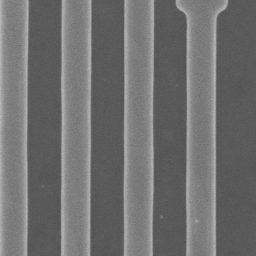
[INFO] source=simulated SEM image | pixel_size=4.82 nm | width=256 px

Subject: wiring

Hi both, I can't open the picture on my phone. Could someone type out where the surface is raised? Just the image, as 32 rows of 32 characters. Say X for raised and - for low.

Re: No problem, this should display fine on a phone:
XXX-----XXX-----XXX---XXXXXX----
XXX-----XXX-----XXX----XXXX-----
XXX-----XXX-----XXX----XXXX-----
XXX-----XXX-----XXX----XXXX-----
XXX-----XXX-----XXX----XXXX-----
XXX-----XXX-----XXX----XXXX-----
XXX-----XXX-----XXX----XXXX-----
XXX-----XXX-----XXX----XXXX-----
XXX-----XXX-----XXX----XXXX-----
XXX-----XXX-----XXX----XXXX-----
XXX-----XXX-----XXX----XXXX-----
XXX-----XXX-----XXX----XXXX-----
XXX-----XXX-----XXX----XXXX-----
XXX-----XXX-----XXX----XXXX-----
XXX-----XXX-----XXX----XXXX-----
XXX-----XXX-----XXX----XXXX-----
XXX-----XXX-----XXX----XXXX-----
XXX-----XXX-----XXX----XXXX-----
XXX-----XXX-----XXX----XXXX-----
XXX-----XXX-----XXX----XXXX-----
XXX-----XXX-----XXX----XXXX-----
XXX-----XXX-----XXX----XXXX-----
XXX-----XXX-----XXX----XXXX-----
XXX-----XXX-----XXX----XXXX-----
XXX-----XXX-----XXX----XXXX-----
XXX-----XXX-----XXX----XXXX-----
XXX-----XXX-----XXX----XXXX-----
XXX-----XXX-----XXX----XXXX-----
XXX-----XXX-----XXX----XXXX-----
XXX-----XXX-----XXX----XXXX-----
XXX-----XXX-----XXX----XXXX-----
XXX-----XXX-----XXX----XXXX-----